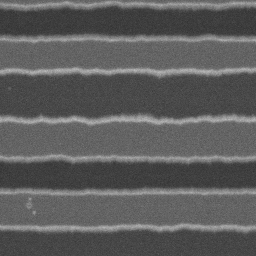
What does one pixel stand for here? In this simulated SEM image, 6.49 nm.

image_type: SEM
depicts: lines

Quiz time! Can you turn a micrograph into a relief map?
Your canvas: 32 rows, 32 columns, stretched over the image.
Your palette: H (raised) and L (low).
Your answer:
HHHHHHHHLHHHLLLHHLHHHHHHHHHHHLLL
LLLLLLLLLLLLLLLLLLLLLLLLLLLLLLLL
LLLLLLLLLLLLLLLLLLLLLLLLLLLLLLLL
LLLLLLLLLLLLLLLLLLLLLLLLLLLLLLLL
LLLLLLLLLLLLLLLLLLLLLLLLLLLLLLLL
HHHHHHHHHHHHHHHHHHHHHHHHHHHHHHHH
HHHHHHHHHHHHHHHHHHHHHHHHHHHHHHHH
HHHHHHHHHHHHHHHHHHHHHHHHHHHHHHHH
HHHHHHHHHHHHHHHHHHHHHHHHHHHHHHHH
LLLLLLLLLLLLLLLLLLLLLLLLLLLLLLLL
LLLLLLLLLLLLLLLLLLLLLLLLLLLLLLLL
LLLLLLLLLLLLLLLLLLLLLLLLLLLLLLLL
LLLLLLLLLLLLLLLLLLLLLLLLLLLLLLLL
LLLLLLLLLLLLLLLLLLLLLLLLLLLLLLLL
LLLLLLLLLLLLLLLLLLLLLLLLLLLLLLLL
HHHHHHHHHHHHHHHHHHHHHHHHHHHHHHHH
HHHHHHHHHHHHHHHHHHHHHHHHHHHHHHHH
HHHHHHHHHHHHHHHHHHHHHHHHHHHHHHHH
HHHHHHHHHHHHHHHHHHHHHHHHHHHHHHHH
HHHHHHHHHHHHHHHHHHHHHHHHHHHHHHHH
LLLLLLLLLLLLLLLLLLLLLLLLLLLLLLLL
LLLLLLLLLLLLLLLLLLLLLLLLLLLLLLLL
LLLLLLLLLLLLLLLLLLLLLLLLLLLLLLLL
LLLLLLLLLLLLLLLLLLLLLLLLLLLLLLLL
HHHHHHHHHHHHHHHHHHHHHHHHHHHHHHHH
HHHHHHHHHHHHHHHHHHHHHHHHHHHHHHHH
HHHHHHHHHHHHHHHHHHHHHHHHHHHHHHHH
HHHHHHHHHHHHHHHHHHHHHHHHHHHHHHHH
LLLLLLLLLLLLLLLLLLLLLLLLLLLLLLLL
LLLLLLLLLLLLLLLLLLLLLLLLLLLLLLLL
LLLLLLLLLLLLLLLLLLLLLLLLLLLLLLLL
LLLLLLLLLLLLLLLLLLLLLLLLLLLLLLLL